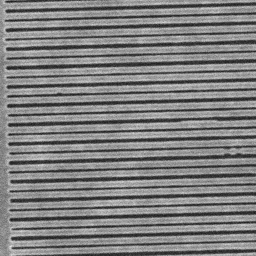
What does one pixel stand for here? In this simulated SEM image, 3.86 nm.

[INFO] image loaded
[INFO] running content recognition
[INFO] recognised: parallel lines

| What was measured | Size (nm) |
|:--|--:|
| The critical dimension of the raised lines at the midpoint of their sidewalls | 21.2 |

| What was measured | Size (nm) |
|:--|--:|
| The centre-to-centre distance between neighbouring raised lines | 36.5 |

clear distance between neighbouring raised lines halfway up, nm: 14.5